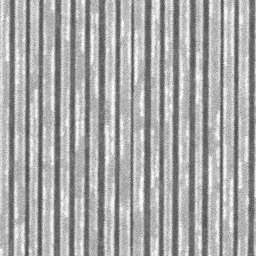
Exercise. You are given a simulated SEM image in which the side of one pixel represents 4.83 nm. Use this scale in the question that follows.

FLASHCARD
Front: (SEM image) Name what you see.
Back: parallel lines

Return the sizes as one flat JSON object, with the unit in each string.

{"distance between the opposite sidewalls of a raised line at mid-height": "45.3 nm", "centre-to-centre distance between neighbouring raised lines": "0.072 um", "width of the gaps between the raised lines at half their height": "32.6 nanometres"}